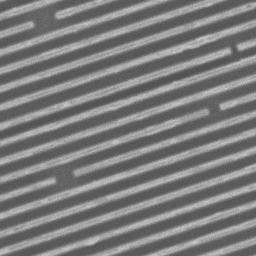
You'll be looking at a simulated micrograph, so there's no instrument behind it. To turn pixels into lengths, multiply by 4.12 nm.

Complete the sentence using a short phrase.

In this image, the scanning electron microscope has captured parallel lines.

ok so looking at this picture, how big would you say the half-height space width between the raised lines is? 38.6 nm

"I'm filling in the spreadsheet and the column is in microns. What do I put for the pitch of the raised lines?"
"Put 0.0711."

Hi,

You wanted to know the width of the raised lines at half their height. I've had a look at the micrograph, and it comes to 30.8 nm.